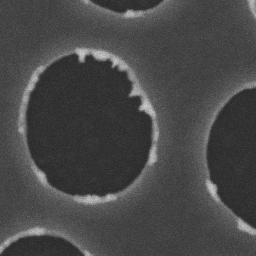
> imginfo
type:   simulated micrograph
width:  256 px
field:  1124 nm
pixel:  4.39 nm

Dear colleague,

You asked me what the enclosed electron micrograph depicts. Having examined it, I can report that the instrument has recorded holes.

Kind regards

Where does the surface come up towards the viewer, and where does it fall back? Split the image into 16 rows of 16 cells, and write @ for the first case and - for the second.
@@@@@@@---@@@@@@
@@@@@@@@@@@@@@@@
@@@@@@@@@@@@@@@@
@@@@-@@@@@@@@@@@
@@@-----@@@@@@@@
@@------@@@@@@@@
@@-------@@@@@--
@@-------@@@@---
@@--------@@@---
@@-------@@@@---
@@-------@@@@---
@@@-----@@@@@---
@@@@@@@@@@@@@@--
@@@@@@@@@@@@@@@-
@@@@@@@@@@@@@@@@
-----@@@@@@@@@@@